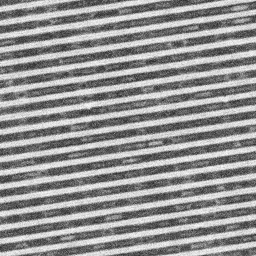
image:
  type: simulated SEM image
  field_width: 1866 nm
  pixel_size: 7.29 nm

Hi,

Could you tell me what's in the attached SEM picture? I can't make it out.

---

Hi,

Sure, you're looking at parallel lines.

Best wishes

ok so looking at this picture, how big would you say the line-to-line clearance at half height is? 0.0685 µm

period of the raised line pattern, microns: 0.0985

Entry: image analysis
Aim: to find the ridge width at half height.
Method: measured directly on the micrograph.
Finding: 31.6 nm